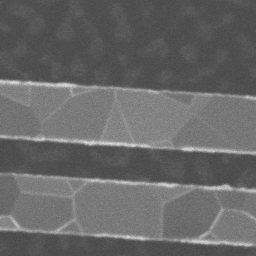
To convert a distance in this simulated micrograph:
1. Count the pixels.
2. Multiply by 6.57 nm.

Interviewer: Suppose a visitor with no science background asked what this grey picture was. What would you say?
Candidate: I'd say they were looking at one or a few lines or trenches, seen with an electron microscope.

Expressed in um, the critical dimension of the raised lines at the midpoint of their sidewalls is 0.377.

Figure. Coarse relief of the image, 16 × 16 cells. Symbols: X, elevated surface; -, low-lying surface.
----------------
----------------
----------------
----------------
----------------
XXXXXXX---------
XXXXXXXXXXXXXXXX
XXXXXXXXXXXXXXXX
XXXXXXXXXXXXXXXX
-------------XXX
----------------
XXXXXXXXXXX-----
XXXXXXXXXXXXXXXX
XXXXXXXXXXXXXXXX
--XXXXXXXXXXXXXX
----------------